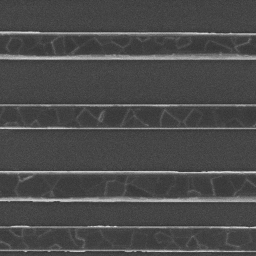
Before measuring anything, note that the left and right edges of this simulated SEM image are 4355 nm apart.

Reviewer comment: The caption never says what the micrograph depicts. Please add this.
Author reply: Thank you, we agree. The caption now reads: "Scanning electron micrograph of lines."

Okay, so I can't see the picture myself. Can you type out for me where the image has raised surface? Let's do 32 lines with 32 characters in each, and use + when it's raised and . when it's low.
................................
................................
................................
................................
++++++++++++++++++++++++++++++++
++++++++++++++++++++++++++++++++
++++++++++++++++++++++++++++++++
................................
................................
................................
................................
................................
................................
++++++++++++++++++++++++++++++++
++++++++++++++++++++++++++++++++
++++++++++++++++++++++++++++++++
................................
................................
................................
................................
................................
++++++++++++++++++++++......+...
++++++++++++++++++++++++++++++++
++++++++++++++++++++++++++++++++
++++++++++++++++++++++++++++++++
................................
................................
................................
++++++++++++++++++++++++++++++++
++++++++++++++++++++++++++++++++
++++++++++++++++++++++++++++++++
................................